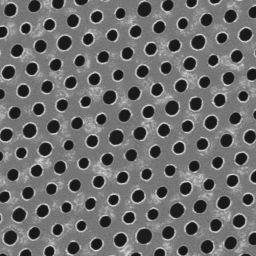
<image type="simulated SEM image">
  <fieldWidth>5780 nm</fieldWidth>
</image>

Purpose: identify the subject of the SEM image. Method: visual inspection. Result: a regular array of holes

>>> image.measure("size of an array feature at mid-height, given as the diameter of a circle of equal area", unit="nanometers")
264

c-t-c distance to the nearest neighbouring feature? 528 nanometers